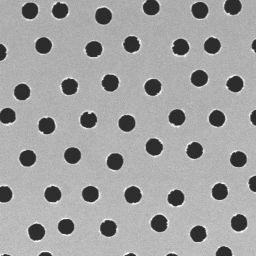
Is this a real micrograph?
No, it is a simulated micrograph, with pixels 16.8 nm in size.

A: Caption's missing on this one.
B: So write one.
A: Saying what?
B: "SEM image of a regular array of holes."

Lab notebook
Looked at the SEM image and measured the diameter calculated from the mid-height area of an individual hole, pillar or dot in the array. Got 278 nm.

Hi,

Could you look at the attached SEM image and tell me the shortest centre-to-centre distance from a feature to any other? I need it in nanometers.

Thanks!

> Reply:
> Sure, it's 623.